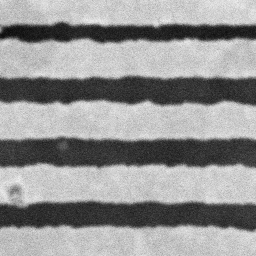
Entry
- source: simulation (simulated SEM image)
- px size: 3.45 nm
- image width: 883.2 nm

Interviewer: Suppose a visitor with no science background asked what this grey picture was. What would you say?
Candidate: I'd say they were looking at lines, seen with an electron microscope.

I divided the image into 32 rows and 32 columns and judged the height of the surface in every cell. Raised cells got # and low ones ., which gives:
################################
################################
################################
................................
................................
################################
################################
################################
################################
###############...##############
................................
................................
................................
################################
################################
################################
################################
................................
................................
................................
................................
################################
################################
################################
################################
.###............................
................................
................................
.#...####..#####...##.#####.....
################################
################################
################################